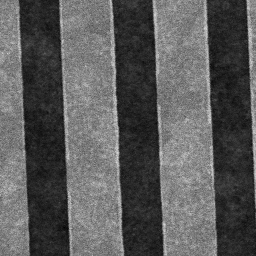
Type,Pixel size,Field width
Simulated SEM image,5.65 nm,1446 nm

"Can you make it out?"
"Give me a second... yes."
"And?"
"one or a few lines or trenches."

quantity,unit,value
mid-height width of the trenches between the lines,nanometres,232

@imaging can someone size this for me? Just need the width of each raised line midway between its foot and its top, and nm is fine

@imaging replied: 295